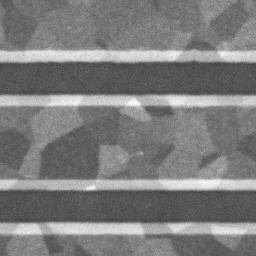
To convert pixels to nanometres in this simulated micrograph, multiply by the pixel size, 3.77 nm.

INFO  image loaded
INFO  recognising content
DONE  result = one or a few lines or trenches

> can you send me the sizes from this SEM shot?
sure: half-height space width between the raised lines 0.172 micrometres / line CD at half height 313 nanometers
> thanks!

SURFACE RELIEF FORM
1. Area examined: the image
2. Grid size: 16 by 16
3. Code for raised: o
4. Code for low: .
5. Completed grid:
oooooooooooooooo
oooooooooooooooo
oooooooooooooooo
................
................
................
oooooooooooooooo
oooooooooooooooo
oooooooooooooooo
oooooooooooooooo
oooooooooooooooo
o..o.ooooooo.ooo
................
................
oooooooooooooooo
oooooooooooooooo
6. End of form